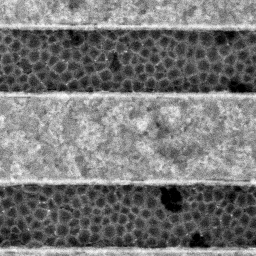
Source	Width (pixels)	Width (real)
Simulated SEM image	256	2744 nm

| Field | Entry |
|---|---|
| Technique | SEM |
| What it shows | one or a few lines or trenches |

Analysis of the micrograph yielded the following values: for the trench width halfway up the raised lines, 749 nm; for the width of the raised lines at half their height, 921 nm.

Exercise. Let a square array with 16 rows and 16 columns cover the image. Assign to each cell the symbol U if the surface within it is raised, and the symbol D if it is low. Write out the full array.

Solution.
UUUUUUUUUUUUUUUU
UUUUUUUUUUUUUUUU
DDDDDDDDDDDDDDDD
DDDDDDDDDDDDDDDD
DDDDDDDDDDDDDDDD
DDDDDDDDDDDDDDDD
UUUUUUUUUUUUUUUU
UUUUUUUUUUUUUUUU
UUUUUUUUUUUUUUUU
UUUUUUUUUUUUUUUU
UUUUUUUUUUUUUUUU
DDDDDDDDDDDDDDDD
DDDDDDDDDDDDDDDD
DDDDDDDDDDDDDDDD
DDDDDDDDDDDDDDDD
DDDDDDDDDDDDDDDD